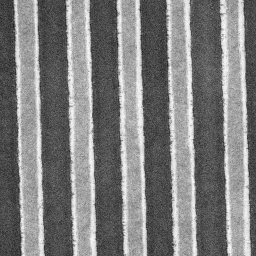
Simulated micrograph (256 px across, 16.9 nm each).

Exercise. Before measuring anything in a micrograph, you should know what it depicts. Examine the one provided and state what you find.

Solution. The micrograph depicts lines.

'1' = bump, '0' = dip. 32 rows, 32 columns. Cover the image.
00111000111000011000011000001100
00111000111000011000011100001100
00111000111000011000011100001100
00111000111000011000011100001100
00111000111000011000011100001100
00111000011000011000011100001100
00111000011000011000011100001100
00111000011000011000011100001100
00111000011000011000011100001100
00111000011000011000011100001100
00111000011000011000011100001110
00111000011000011100011100001110
00111000011000011100011100001110
00111000011000011100011100001110
00111000011000011100011100001110
00111000011000011100011100001110
00111000011000011100011100001110
00111000011000011100011100001110
00111000011100011100011100001110
00111000011100011100001100001110
00111000011100011100001100001110
00111000011100011100001100001110
00011000011100011100001100001110
00011000011100011100001100001110
00011000011100011100001100001110
00011000011100001100001100001110
00011000011100001100001100001110
00011000011100001100001100000110
00011000011100001100001100000110
00011000011100001100001100000110
00011000011100001100001100000110
00011000011100001100001100000110